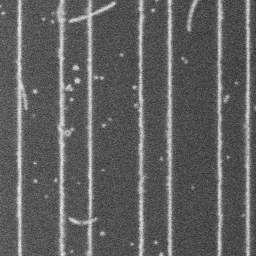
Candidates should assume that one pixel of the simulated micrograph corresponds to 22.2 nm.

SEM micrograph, lines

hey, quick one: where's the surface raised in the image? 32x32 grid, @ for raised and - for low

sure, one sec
@@------@@@-------@@@------@@@@-
@@------@@@-------@@@------@@@@-
@@------@@@-------@@@------@@@@-
@@------@@@------@@@@------@@@@-
@@------@@@-------@@@------@@@@-
@@------@@@------@@@@------@@@@-
@@------@@@-------@@@------@@@@-
@@------@@@-------@@@------@@@@-
@@------@@@------@@@@------@@@@-
@@------@@@-------@@@------@@@@-
@@------@@@------@@@@------@@@@-
@@------@@@------@@@@------@@@@-
@@------@@@-------@@@------@@@@-
@@------@@@-------@@@------@@@@-
@@------@@@-------@@@------@@@@-
@@------@@@-------@@@------@@@@-
@@------@@@-------@@@------@@@@-
@@------@@@-------@@@------@@@@-
@@------@@@------@@@@------@@@@-
@@------@@@-------@@@------@@@@-
@@------@@@-------@@@------@@@@-
@@------@@@-------@@@------@@@@-
@@------@@@-------@@@------@@@@-
@@------@@@-------@@@------@@@@-
@@------@@@-------@@@------@@@@-
@@------@@@-------@@@------@@@@-
@@------@@@-------@@@------@@@@-
@@------@@@@------@@@------@@@@-
@@------@@@-------@@@------@@@@-
@@------@@@-------@@@------@@@@-
@@------@@@-------@@@------@@@@-
@@------@@@-------@@@------@@@@-